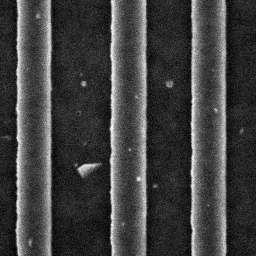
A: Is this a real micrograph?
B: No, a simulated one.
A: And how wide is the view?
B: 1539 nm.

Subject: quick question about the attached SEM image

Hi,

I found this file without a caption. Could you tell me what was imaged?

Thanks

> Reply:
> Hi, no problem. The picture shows lines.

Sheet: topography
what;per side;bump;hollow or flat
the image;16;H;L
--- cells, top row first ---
LHHLLLLHHLLLHHLL
LHHLLLLHHLLLHHLL
LHHLLLLHHLLLHHLL
LHHLLLLHHLLLHHLL
LHHLLLLHHLLLHHLL
LHHLLLLHHLLLHHLL
LHHLLLLHHLLLHHLL
LHHLLLLHHLLLHHLL
LHHLLLLHHLLLHHLL
LHHLLLLHHLLLHHLL
LHHLLLLHHLLLHHLL
LHHLLLLHHLLLHHLL
LHHLLLLHHLLLHHLL
LHHLLLLHHLLLHHLL
LHHLLLLHHLLLHHLL
LHHLLLLHHLLLHHLL